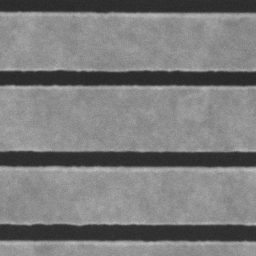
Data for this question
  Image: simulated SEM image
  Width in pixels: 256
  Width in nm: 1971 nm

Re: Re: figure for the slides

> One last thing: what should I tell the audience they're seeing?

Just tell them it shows lines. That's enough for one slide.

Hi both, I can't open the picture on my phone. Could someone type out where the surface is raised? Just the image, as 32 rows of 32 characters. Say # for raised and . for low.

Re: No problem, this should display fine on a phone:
................................
................................
################################
################################
################################
################################
################################
################################
################################
................................
................................
################################
################################
################################
################################
################################
################################
################################
################################
................................
................................
################################
################################
################################
################################
################################
################################
################################
................................
................................
################################
################################